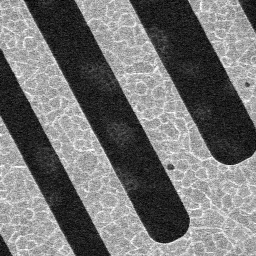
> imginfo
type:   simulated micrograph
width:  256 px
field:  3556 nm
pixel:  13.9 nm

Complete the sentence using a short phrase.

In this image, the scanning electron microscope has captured one or a few lines or trenches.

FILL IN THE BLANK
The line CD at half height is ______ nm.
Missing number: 588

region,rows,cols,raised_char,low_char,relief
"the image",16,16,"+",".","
++...+++....+++.
++...++++....+++
+++...+++....+++
+++....+++....++
.+++...+++....++
.+++....+++....+
..+++...+++....+
..+++....+++....
+..+++...++++...
+...++....+++...
++..+++...++++++
++...+++...+++++
+++..+++...+++++
+++...+++...++++
++++..+++...++++
.+++...+++++++++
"